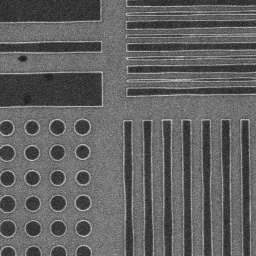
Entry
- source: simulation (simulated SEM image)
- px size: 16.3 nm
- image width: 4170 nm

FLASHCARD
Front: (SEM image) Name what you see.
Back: groups of lines, slits or small figures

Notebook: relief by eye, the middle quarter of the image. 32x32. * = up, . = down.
...................*************
................****************
*********.......................
**********......................
**********......................
**********......................
**********......****************
**********......****************
**********......................
**********......................
**********......................
................................
................................
................................
...***.........**...**...**...**
...****........**...**...**...**
...****........**...**...**...**
...***.........**...**...**...**
...............**...**...**...**
...............**...**...**...**
....**.........**...**...**...**
...***.........**...**...**...**
...***.........**...**...**...**
....**.........**...**...**...**
...............**...**...**...**
...............**...**...**...**
...............**...**...**...**
...***.........**...**...**...**
...****........**...**...**...**
...***.........**...**...**...**
...............**...**...**...**
...............**...**...**...**